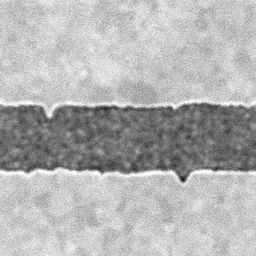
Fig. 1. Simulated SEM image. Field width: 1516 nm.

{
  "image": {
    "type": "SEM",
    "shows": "one or a few lines or trenches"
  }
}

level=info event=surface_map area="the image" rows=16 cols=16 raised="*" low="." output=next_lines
****************
****************
****************
****************
****************
****************
*.**.*******..**
................
................
................
................
****************
****************
****************
****************
****************